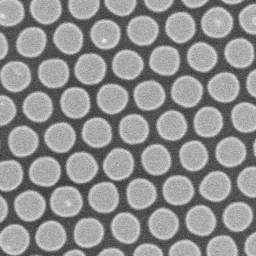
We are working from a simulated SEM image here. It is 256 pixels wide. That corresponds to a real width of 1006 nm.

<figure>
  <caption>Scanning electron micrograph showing an array of small figures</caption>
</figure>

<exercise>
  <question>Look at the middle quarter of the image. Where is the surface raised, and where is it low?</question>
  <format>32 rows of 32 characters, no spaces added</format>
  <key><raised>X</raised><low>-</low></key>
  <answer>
X--XXXXXXX--XXXXXXXX--XXXXXXX---
X--XXXXXXX--XXXXXXX---XXXXXX----
X--XXXXXXX---XXXXXX-----XXX-----
X--XXXXXXX-----XXX-----------XXX
-----XXXX-----------XXX-----XXXX
----------XXXX----XXXXXX---XXXXX
-XXXX----XXXXXX---XXXXXXX--XXXXX
XXXXXX---XXXXXXX--XXXXXXX--XXXXX
XXXXXX--XXXXXXXX--XXXXXXX--XXXXX
XXXXXX--XXXXXXXX--XXXXXXX---XXXX
XXXXXX---XXXXXX----XXXXX------XX
XXXXXX---XXXXX------------------
XXXXX--------------------XXXX---
--------X------XXXXX----XXXXXX--
------XXXXX---XXXXXXX--XXXXXXX--
X----XXXXXX---XXXXXXX--XXXXXXXX-
XX---XXXXXXX--XXXXXXX---XXXXXX--
XXX--XXXXXXX--XXXXXXX---XXXXXX--
XXX--XXXXXXX--XXXXXX-----XXXX---
XX---XXXXXX-----XXX-------------
XX-----XXX------------XX------XX
X-----------XXX-----XXXXX----XXX
--XXXX-----XXXXXX---XXXXXX---XXX
-XXXXXX----XXXXXX--XXXXXXXX--XXX
-XXXXXXX--XXXXXXX---XXXXXXX--XXX
-XXXXXXX--XXXXXXX---XXXXXX----XX
-XXXXXXX--XXXXXXX---XXXXXX-----X
-XXXXXXX---XXXXXX-----XX--------
--XXXXX-----XXX-----------XXXXX-
---XX------------XXXX----XXXXXXX
-------XXXXXX---XXXXXX---XXXXXXX
XXX----XXXXXX---XXXXXXX--XXXXXXX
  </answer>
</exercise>